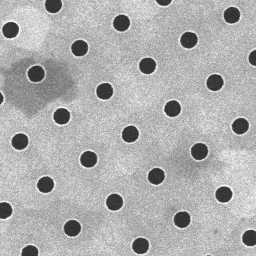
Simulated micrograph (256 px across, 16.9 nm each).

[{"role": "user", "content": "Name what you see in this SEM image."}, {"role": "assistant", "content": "a regular array of holes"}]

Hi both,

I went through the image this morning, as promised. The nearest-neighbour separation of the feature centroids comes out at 828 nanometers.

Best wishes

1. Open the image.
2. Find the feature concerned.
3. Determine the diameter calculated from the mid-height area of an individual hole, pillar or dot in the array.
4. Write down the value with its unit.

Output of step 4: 295 nanometers